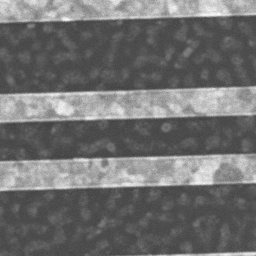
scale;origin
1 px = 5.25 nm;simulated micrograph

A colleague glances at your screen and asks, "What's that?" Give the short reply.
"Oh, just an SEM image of one or a few lines or trenches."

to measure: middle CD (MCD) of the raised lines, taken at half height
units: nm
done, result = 139